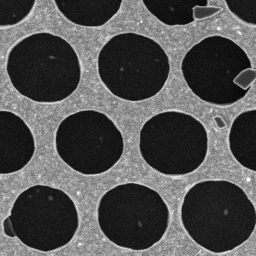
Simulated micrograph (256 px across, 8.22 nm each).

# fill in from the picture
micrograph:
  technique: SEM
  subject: holes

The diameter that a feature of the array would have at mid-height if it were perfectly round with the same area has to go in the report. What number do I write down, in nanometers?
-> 561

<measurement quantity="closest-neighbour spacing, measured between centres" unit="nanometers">686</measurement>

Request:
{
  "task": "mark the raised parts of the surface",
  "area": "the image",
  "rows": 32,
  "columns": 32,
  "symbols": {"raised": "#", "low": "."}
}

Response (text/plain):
....###........###........##....
....####.......####.....#####...
...######.....######....######..
################################
####...#######....##############
##.......####.......#####.....##
#........###.........##........#
#.........##.........##........#
#.........##.........##........#
#.........##.........##.......##
##........###........##.......##
##.......#####......####.......#
####....########..#######.....##
################################
..#######....######.....######..
...####.......####.......####...
....###........###........###...
....###........##.........###...
....###........##.........###...
....###........###........###...
...#####......####.......#####..
..########...#######....########
##########################..####
####...#######.....#####......##
##.......####.......###........#
##.......###.........##.........
#.........##.........##.........
#.........##.........##.........
..........###........##.........
#........####.......####.......#
###.....######.....######.....##
###########################.####